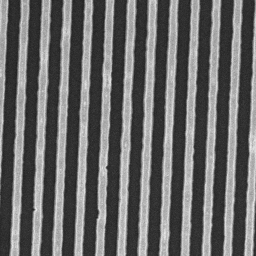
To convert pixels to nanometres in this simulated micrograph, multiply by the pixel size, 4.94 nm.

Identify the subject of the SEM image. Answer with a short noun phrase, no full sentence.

parallel lines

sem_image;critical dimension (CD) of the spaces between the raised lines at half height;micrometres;0.0642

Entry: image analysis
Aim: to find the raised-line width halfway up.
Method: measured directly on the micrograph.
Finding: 0.037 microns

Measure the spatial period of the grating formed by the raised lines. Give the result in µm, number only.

0.105